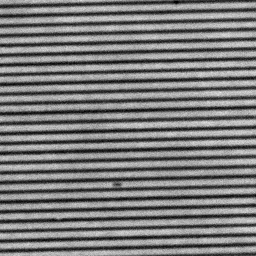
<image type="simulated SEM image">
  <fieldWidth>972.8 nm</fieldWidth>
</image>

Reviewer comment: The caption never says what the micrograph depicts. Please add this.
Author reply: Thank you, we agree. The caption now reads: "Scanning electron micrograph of parallel lines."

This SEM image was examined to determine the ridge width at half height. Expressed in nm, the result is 22.3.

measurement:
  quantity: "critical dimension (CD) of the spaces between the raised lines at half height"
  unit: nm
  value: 15.2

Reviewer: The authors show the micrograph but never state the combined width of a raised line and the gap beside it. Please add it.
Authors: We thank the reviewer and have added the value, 0.0371 µm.